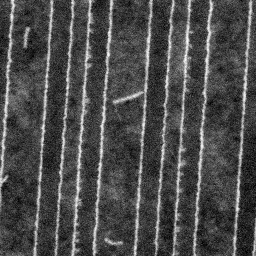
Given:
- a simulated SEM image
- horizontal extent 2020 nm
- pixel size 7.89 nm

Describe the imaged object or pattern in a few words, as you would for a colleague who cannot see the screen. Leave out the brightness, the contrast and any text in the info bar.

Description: lines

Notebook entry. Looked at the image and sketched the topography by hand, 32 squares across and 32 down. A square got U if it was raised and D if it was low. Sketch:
DDUUUUUDDUUDDDUUUUUDDDUUDDUUUUUD
DDUUUUDDDUUDDDUUUUUDDUUUDDUUUUUD
DUUUUUDDDUUDDDUUUUUDDUUUDDUUUUUD
DUUUUUDDDUUDDDUUUUUDDUUUDDUUUUUD
DUUUUUDDDUUDDDUUUUUDDUUDDDUUUUUD
DUUUUUDDDUUDDUUUUUUDDUUDDDUUUUUD
DUUUUUDDDUUDDUUUUUUDDUUDDDUUUUUD
DUUUUUDDDUUDDUUUUUDDDUUDDDUUUUUD
DUUUUUDDDUUDDUUUUUDDDUUDDDUUUUUD
DUUUUUDDUUUDDUUUUUDDDUUDDDUUUUUD
DUUUUUDDUUUDDUUUUUDDDUUDDDUUUUUD
DUUUUUDDUUUDDUUUUUDDDUUDDDUUUUUD
DUUUUUDDUUUDDUUUUUDDDUUDDDUUUUUD
DUUUUUDDUUDDDUUUUUDDDUUDDUUUUUUD
DUUUUUDDUUDDDUUUUUDDDUUDDUUUUUUD
DUUUUDDDUUDDDUUUUUDDDUUDDUUUUUDD
UUUUUDDDUUDDDUUUUUDDUUUDDUUUUUDD
UUUUUDDDUUDDDUUUUUDDUUUDDUUUUUDD
UUUUUDDDUUDDDUUUUUDDUUUDDUUUUUDD
UUUUUDDDUUDDDUUUUUDDUUDDDUUUUUDD
UUUUUDDDUUDDUUUUUUDDUUDDDUUUUUDD
UUUUUDDDUUDDUUUUUUDDUUDDDUUUUUDD
UUUUUDDDUUDDUUUUUUDDUUDDDUUUUUDD
UUUUUDDUUUDDUUUUUDDDUUDDDUUUUUDD
UUUUUDDUUUDDUUUUUDDDUUDDDUUUUUDD
UUUUUDDUUUDDUUUUUDDDUUDDDUUUUUDD
UUUUUDDUUUDDUUUUUDDDUUDDDUUUUUDD
UUUUUDDUUDDDUUUUUDDDUUDDDUUUUUDD
UUUUUDDUUDDDUUUUUDDDUUDDUUUUUUDD
UUUUUDDUUDDDUUUUUDDDUUDDUUUUUDDD
UUUUUDDUUDDDUUUUUDDUUUDDUUUUUDDD
UUUUDDDUUDDDUUUUUDDUUUDDUUUUUDDD